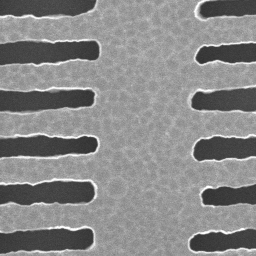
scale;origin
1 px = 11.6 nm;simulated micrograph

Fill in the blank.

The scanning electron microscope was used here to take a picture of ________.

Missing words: holes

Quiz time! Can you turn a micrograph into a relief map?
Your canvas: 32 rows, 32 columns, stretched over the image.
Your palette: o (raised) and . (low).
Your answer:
............ooooooooooooo.......
...........oooooooooooooo.......
oooooooooooooooooooooooooooooooo
oooooooooooooooooooooooooooooooo
oooooooooooooooooooooooooooooooo
............ooooooooooooooooo...
............ooooooooooooo.......
.........o..ooooooooooooo.......
oooooooooooooooooooooooooooooooo
oooooooooooooooooooooooooooooooo
oooooooooooooooooooooooooooooooo
............ooooooooooooooo.....
............oooooooooooo........
........oooooooooooooooo........
oooooooooooooooooooooooooooooooo
oooooooooooooooooooooooooooooooo
oooooooooooooooooooooooooooooooo
............ooooooooooooo.......
............oooooooooooo........
..o....ooooooooooooooooo........
oooooooooooooooooooooooooooooooo
oooooooooooooooooooooooooooooooo
oooooooooooooooooooooooooooooooo
............ooooooooooooooo.....
............ooooooooooooo.......
.o..oooooooooooooooooooooo......
oooooooooooooooooooooooooooooooo
oooooooooooooooooooooooooooooooo
oooooooooooooooooooooooooooooooo
............oooooooooooo........
...........ooooooooooooo........
.ooooooooooooooooooooooooooooooo